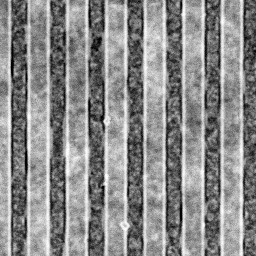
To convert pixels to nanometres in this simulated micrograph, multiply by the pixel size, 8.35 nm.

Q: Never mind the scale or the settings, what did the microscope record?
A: parallel lines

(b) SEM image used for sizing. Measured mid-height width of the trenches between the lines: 145 nm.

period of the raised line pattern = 323 nm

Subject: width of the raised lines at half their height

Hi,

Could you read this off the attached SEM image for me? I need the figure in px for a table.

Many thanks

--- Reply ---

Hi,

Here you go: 20.8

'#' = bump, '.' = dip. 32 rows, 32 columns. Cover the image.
#...##..###..###..###..##...##..
#...##..###..###..###..###..##..
#...##..###..###..###..##...##..
#...##..###..###..###..##...##..
#...##..###..###..###..##...##..
#...##..###..###..###..##...##..
#...##..###..###..###..##...##..
#...##..###..###..###..##...##..
#...##..###..###..###..##...##..
#...##..###..###..###..##...##..
#...##..###..###..###..##...##..
#...##..###..###..###..##...##..
#...##..###..###..###..##...##..
#...##..###..###..###..##...##..
#...##..###..###..###..##...##..
#...##..###..###..###..##...##..
#..###..###..###..###..##...##..
#..###..###..###..###..##...##..
#..###..###..###..###..##...##..
#..###..###..###..###..##...##..
#..###..###..###..###..##...##..
#..###..###..###..###..##...##..
#..###..###..###..###..##...##..
#..###..###..###..###..##...##..
#..###..###..###..###..##...##..
#..###..###..###..###..##...##..
#..###..###..###..###..##...##..
#..###..###..###..###..###..##..
#..###..###..###..###..###..##..
#..###..###..###..###..##...##..
#..###..###..###..###..##...##..
#..###..###..###..###..##...##..